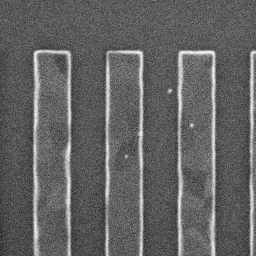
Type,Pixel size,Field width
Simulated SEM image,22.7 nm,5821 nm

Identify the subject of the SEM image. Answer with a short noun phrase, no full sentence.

wiring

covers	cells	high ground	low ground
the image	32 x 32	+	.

................................
................................
................................
................................
................................
................................
.....++.......+.................
....+++++....+++++.....++++....+
.....++++....+++++.....++++.....
.....++++....+++++.....++++.....
.....++++....+++++.....++++.....
.....++++.....++++.....++++.....
.....++++.....++++.....++++.....
.....++++....+++++.....++++....+
.....++++....+++++.....++++....+
....+++++....+++++....+++++.....
....+++++....+++++....+++++....+
....+++++....+++++....+++++....+
....+++++....+++++....+++++....+
....++++.....+++++.....++++....+
....++++.....+++++.....++++....+
....++++.....+++++.....++++....+
....+++++....+++++.....++++....+
.....++++....+++++.....++++....+
....++++.....+++++.....++++.....
....++++.....+++++.....++++.....
....++++.....+++++.....++++....+
....+++++....+++++.....++++....+
....+++++....+++++.....++++.....
.....++++....+++++.....+++.....+
.....++++....+++++.....++++....+
.....++++....+++++.....++++....+